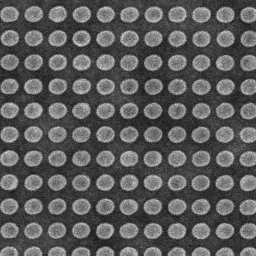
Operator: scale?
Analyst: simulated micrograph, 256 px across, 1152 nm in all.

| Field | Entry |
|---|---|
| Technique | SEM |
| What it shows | a regular array of raised bodies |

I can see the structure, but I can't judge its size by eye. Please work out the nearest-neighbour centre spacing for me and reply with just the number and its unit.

107 nm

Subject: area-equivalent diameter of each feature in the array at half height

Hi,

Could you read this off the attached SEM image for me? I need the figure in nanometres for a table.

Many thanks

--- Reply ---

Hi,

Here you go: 73